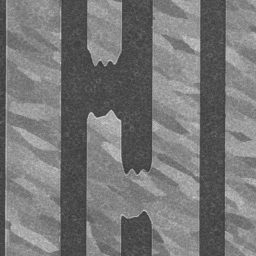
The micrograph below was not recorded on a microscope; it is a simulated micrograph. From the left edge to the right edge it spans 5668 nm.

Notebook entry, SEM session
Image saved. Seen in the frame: one or a few lines or trenches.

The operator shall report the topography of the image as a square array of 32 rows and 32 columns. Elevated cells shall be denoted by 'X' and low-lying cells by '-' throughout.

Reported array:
-XXXXXXX---XXXX----XXXXXX---XXXX
-XXXXXXX---XXXX----XXXXXX---XXXX
-XXXXXXX---XXXX----XXXXXX---XXXX
-XXXXXXX---XXXX----XXXXXX---XXXX
-XXXXXXX---XXXX----XXXXXX---XXXX
-XXXXXXX---XXXX----XXXXXX---XXXX
-XXXXXXX---XXXX----XXXXXX---XXXX
-XXXXXXX----XXX----XXXXXX---XXXX
-XXXXXXX-----------XXXXXX---XXXX
-XXXXXXX-----------XXXXXX---XXXX
-XXXXXXX-----------XXXXXX---XXXX
-XXXXXXX-----------XXXXXX---XXXX
-XXXXXXX-----------XXXXXX---XXXX
-XXXXXXX-----------XXXXXX---XXXX
-XXXXXX----X-X-----XXXXXX---XXXX
-XXXXXX----XXXX----XXXXXX---XXXX
-XXXXXX----XXXX----XXXXXX---XXXX
-XXXXXX----XXXX----XXXXXX---XXXX
-XXXXXX----XXXX----XXXXXX---XXXX
-XXXXXX----XXXX----XXXXXX---XXXX
-XXXXXX----XXXX----XXXXXX---XXXX
-XXXXXX----XXXXXX-XXXXXXX---XXXX
-XXXXXX----XXXXXXXXXXXXXX---XXXX
-XXXXXX----XXXXXXXXXXXXXX---XXXX
-XXXXXX----XXXXXXXXXXXXXX---XXXX
-XXXXXX----XXXXXXXXXXXXXX---XXXX
-XXXXXX----XXXXXXXXXXXXXX---XXXX
-XXXXXX----XXXX----XXXXXX---XXXX
-XXXXXX----XXXX----XXXXXX---XXXX
-XXXXXX----XXXX----XXXXXX---XXXX
-XXXXXX----XXXX----XXXXXX---XXXX
-XXXXXX----XXXX----XXXXXX---XXXX